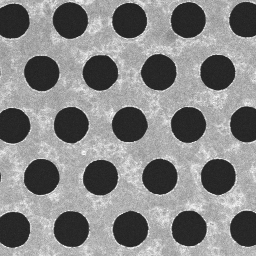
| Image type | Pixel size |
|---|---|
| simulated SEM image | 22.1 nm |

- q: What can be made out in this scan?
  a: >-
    a regular array of holes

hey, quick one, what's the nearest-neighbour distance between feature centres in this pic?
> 58.6 px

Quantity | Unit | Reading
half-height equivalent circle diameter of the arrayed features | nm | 786